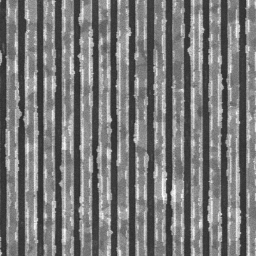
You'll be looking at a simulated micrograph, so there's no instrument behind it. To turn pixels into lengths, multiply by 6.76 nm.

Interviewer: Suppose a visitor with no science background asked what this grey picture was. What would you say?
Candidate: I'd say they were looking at parallel lines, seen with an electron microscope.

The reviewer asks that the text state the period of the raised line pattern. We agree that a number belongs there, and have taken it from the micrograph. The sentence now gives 124 nm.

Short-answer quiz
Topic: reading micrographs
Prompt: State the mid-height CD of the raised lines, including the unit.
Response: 76.9 nm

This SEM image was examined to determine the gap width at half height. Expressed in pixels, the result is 6.63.